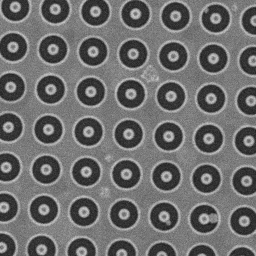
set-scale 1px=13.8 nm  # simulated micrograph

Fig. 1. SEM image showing an array of small figures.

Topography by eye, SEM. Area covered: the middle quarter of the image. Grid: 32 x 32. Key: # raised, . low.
######...######....######.....##
##########################...###
################################
#####...########################
####......#####....#######..####
###.......####......####.....###
###...#...###.......####......##
###...#...###...##...##...##...#
###.......###.......###...##..##
####.....#####......###.......##
######..#######....#####......##
#########################...####
################################
####....########################
###......#####.....######..#####
###.......###......####......###
##...##...###.......###.......##
##...##...##...##...##...##...##
###......####.......###..##...##
###......####......####.......##
#####..#######....#####......###
#########################...####
################################
####...#########################
###.....######....#######.######
##.......####......####.....####
##...#...###.......###.......###
##...#...###...#...###...#...###
##.......###.......###...#...###
###.....#####......###.......###
####...######.....#####......###
########################...#####